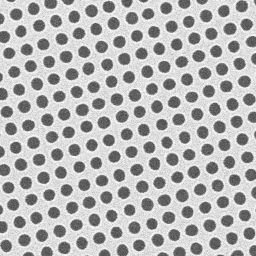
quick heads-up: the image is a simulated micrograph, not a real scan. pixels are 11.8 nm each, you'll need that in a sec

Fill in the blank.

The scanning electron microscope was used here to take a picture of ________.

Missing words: a regular array of holes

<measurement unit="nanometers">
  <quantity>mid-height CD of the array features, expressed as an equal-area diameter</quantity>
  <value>152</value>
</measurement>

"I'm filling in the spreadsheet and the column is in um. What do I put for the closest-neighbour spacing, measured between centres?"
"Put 0.209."